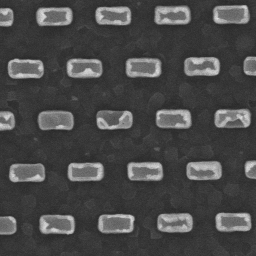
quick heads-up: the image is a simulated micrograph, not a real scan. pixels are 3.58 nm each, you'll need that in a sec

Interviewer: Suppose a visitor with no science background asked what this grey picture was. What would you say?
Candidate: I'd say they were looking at a regular array of raised bodies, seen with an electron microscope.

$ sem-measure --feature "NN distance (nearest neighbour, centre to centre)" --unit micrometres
0.21